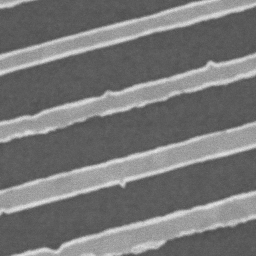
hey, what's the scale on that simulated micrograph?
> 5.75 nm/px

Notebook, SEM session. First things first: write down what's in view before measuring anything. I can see one or a few lines or trenches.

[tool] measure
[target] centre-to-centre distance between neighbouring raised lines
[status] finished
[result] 386 nm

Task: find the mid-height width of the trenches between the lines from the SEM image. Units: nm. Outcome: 278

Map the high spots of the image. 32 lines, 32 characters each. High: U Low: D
UUDDDDDDDDDDDDDDDDDDDDDDUUUUUUUU
DDDDDDDDDDDDDDDDDDDDDUUUUUUUDDDD
DDDDDDDDDDDDDDDDDUUUUUUUUDDDDDDD
DDDDDDDDDDDDDUUUUUUUDDDDDDDDDDDD
DDDDDDDDDDUUUUUUUDDDDDDDDDDDDDDD
DDDDDDUUUUUUUDDDDDDDDDDDDDDDDDDD
DDUUUUUUUDDDDDDDDDDDDDDDDDDDDDDD
UUUUUUDDDDDDDDDDDDDDDDDDDDDDDDUU
UUDDDDDDDDDDDDDDDDDDDDDDDDUUUUUU
DDDDDDDDDDDDDDDDDDDDDDDUUUUUUUDD
DDDDDDDDDDDDDDDDDDDUUUUUUUDDDDDD
DDDDDDDDDDDDDDDUUUUUUUUDDDDDDDDD
DDDDDDDDDDDUUUUUUUUUDDDDDDDDDDDD
DDDDDDDDUUUUUUUUDDDDDDDDDDDDDDDD
DDDDDUUUUUUUDDDDDDDDDDDDDDDDDDDD
UUUUUUUUUDDDDDDDDDDDDDDDDDDDDDDD
UUUUUDDDDDDDDDDDDDDDDDDDDDDDUUUU
UDDDDDDDDDDDDDDDDDDDDDDDUUUUUUUU
DDDDDDDDDDDDDDDDDDDDDUUUUUUUUUUD
DDDDDDDDDDDDDDDDDUUUUUUUUUUDDDDD
DDDDDDDDDDDDDUUUUUUUUUUDDDDDDDDD
DDDDDDDDDUUUUUUUUUUUDDDDDDDDDDDD
DDDDDUUUUUUUUUUUDDDDDDDDDDDDDDDD
DDUUUUUUUUUUDDDDDDDDDDDDDDDDDDDD
UUUUUUUUDDDDDDDDDDDDDDDDDDDDDDDU
UUUUDDDDDDDDDDDDDDDDDDDDDDDUUUUU
DDDDDDDDDDDDDDDDDDDDDDDUUUUUUUUU
DDDDDDDDDDDDDDDDDDDDUUUUUUUUUUDD
DDDDDDDDDDDDDDDDUUUUUUUUUUUDDDDD
DDDDDDDDDDDDUUUUUUUUUUDDDDDDDDDD
DDDDDDDDDUUUUUUUUUUUDDDDDDDDDDDD
DDDDUUUUUUUUUUUUDDDDDDDDDDDDDDDD